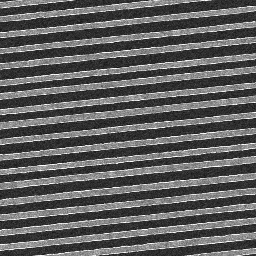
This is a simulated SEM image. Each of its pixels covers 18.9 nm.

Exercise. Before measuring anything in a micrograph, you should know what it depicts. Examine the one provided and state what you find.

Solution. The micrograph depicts parallel lines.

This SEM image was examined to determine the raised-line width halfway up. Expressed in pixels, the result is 5.85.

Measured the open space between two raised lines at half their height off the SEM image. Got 179 nm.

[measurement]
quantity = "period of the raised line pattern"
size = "15.1 px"